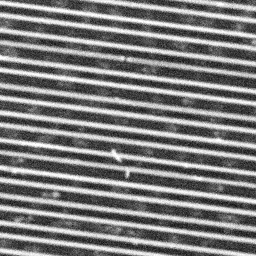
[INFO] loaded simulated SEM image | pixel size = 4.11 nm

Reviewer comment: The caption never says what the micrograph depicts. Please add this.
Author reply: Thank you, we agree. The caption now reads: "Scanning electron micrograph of parallel lines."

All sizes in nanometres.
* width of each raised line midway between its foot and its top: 11.7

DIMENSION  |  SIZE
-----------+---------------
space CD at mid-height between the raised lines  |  39.9 nanometres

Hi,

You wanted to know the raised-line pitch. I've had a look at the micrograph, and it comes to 0.056 micrometres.